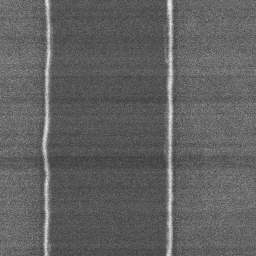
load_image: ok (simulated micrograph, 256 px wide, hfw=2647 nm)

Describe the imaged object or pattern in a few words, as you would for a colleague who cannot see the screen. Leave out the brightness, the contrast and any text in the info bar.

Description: one or a few lines or trenches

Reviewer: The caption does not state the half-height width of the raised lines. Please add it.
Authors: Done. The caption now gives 1280 nm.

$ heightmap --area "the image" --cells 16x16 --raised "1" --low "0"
0001111111100000
0001111111100000
0001111111100000
0001111111100000
0001111111100000
0001111111100000
0001111111100000
0001111111100000
0001111111100000
0001111111100000
0001111111100000
0001111111100000
0001111111100000
0001111111100000
0001111111100000
0001111111100000